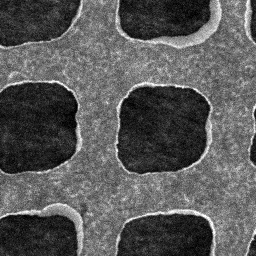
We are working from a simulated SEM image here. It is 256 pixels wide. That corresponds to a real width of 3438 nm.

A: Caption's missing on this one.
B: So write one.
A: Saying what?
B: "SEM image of holes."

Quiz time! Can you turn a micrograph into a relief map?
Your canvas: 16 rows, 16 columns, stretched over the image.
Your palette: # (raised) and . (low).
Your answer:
.....##......###
....###......###
...######...####
################
################
....#####...####
.....###.....###
.....##......###
.....##......###
.....##......###
...#####...#####
################
################
.....####...####
.....###.....###
.....##......###